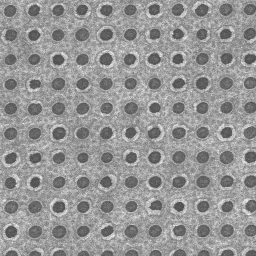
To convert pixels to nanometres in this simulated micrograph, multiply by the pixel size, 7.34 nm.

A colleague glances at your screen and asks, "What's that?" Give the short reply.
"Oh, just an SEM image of a regular array of holes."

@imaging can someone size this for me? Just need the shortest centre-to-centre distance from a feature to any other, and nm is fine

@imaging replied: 175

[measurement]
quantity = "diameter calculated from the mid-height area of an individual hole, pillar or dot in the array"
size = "91.4 nm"